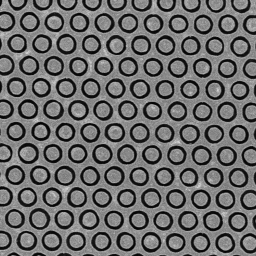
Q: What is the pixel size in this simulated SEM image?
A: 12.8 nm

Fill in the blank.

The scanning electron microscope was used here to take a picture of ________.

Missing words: a regular array of ring-shaped grooves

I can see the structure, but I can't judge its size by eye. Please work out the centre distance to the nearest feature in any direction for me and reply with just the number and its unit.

313 nanometers